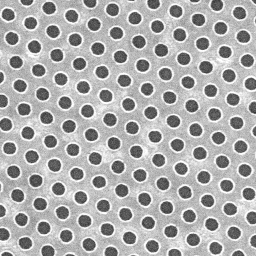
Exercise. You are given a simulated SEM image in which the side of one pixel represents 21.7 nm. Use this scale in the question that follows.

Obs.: a regular array of holes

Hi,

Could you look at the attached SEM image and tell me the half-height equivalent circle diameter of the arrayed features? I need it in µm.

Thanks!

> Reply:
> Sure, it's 0.303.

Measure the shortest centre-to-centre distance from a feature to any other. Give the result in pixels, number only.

23.7